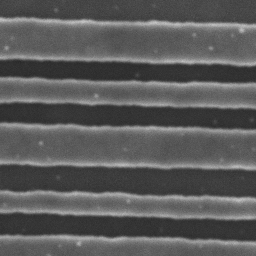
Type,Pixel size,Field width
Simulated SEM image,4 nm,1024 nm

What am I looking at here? lines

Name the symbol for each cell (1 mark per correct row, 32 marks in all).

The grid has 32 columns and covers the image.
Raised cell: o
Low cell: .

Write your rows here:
................................
................................
oooooooo..o.....................
oooooooooooooooooooooooooooooooo
oooooooooooooooooooooooooooooooo
oooooooooooooooooooooooooooooooo
oooooooooooooooooooooooooooooooo
.....ooooooooooooooooooooooooooo
................................
................................
oooooooooooooooooooooooooooooooo
oooooooooooooooooooooooooooooooo
oooooooooooooooooooooooooooooooo
...............................o
................................
ooo.............................
oooooooooooooooooooooooooooooooo
oooooooooooooooooooooooooooooooo
oooooooooooooooooooooooooooooooo
oooooooooooooooooooooooooooooooo
..oooooooooooooooooooooooooooooo
................................
................................
................................
ooooooooooooooooooooooo..o......
oooooooooooooooooooooooooooooooo
oooooooooooooooooooooooooooooooo
................................
................................
ooo..oooo.......................
oooooooooooooooooooooooooooooooo
oooooooooooooooooooooooooooooooo